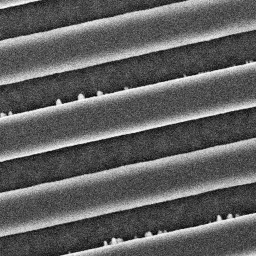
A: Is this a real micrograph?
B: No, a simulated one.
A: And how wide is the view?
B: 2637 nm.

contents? lines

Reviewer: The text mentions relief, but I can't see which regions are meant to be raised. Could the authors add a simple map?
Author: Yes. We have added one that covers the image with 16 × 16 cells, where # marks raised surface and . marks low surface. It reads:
..........######
.....###########
#############...
########........
####.........###
........########
....############
############....
#######.........
###.........####
.......#########
...############.
##########......
######.........#
#..........#####
......##########